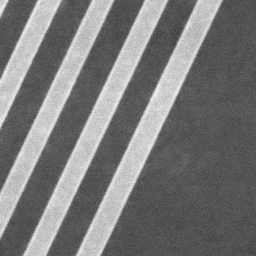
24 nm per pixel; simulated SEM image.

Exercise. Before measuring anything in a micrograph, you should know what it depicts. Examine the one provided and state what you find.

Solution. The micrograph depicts parallel lines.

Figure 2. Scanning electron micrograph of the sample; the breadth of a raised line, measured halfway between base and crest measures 472 nm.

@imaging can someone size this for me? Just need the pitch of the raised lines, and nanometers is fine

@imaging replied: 1160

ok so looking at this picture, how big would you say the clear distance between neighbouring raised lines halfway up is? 0.684 µm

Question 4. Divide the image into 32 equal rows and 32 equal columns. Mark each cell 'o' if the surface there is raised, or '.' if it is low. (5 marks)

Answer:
o....oo....ooo....ooo....oo.....
....ooo....oo....ooo....ooo.....
....oo....ooo....ooo....oo......
...ooo....ooo....oo....ooo......
...oo....ooo....ooo....ooo......
..ooo....ooo....oo....ooo.......
..ooo...ooo....ooo....ooo.......
.ooo....ooo....oo....ooo........
.ooo....oo....ooo....ooo........
ooo....ooo....oo....ooo.........
ooo....oo....ooo....ooo.........
oo....ooo....oo....ooo..........
oo....oo....ooo....ooo..........
o....ooo....oo....ooo...........
o....oo....ooo....ooo...........
....ooo....oo....ooo............
....oo....ooo....ooo............
...ooo....ooo...ooo.............
...oo....ooo....ooo.............
..ooo....ooo....oo..............
..oo....ooo....ooo..............
.ooo....ooo....oo...............
.oo....ooo....ooo...............
ooo....ooo....oo................
oo.....oo....ooo................
oo....ooo....ooo................
oo....oo....ooo.................
o....ooo....ooo.................
o....oo....ooo..................
....ooo....ooo..................
....oo....ooo...................
...ooo....ooo...................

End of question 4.